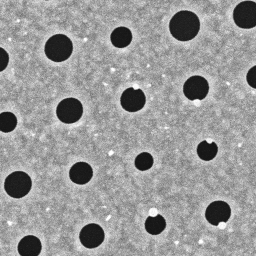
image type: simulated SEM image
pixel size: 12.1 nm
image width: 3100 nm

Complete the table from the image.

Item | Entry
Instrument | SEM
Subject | a regular array of holes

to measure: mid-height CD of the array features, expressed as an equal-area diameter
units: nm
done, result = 311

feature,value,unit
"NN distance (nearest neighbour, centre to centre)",768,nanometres